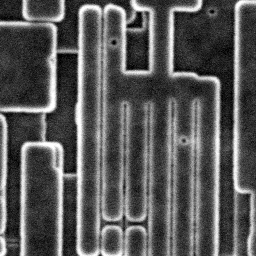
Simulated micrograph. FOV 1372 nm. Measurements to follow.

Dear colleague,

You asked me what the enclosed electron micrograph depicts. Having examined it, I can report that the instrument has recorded wiring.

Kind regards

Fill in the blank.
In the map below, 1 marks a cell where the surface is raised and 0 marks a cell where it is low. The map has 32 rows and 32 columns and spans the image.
00011111000000000111111110000011
00011111001111100001110000000111
00011110001111110001110000000111
11111110001111110001110000000111
11111110001111110001110000000111
11111110001111110001110000000111
11111110001111110001110000000111
11111110001111110001110000000111
11111110001111110001110000000111
11111110001111111111111110000111
11111110001111111111111111100111
11111110001111111111111111100111
11111110001111111111111111100111
11111100001111111111111111100111
00000000001111111111111111100111
10000000001111111111111111100111
10000000001111111111111111100111
10000000001111111111111111100111
10011110001111111111111111100111
10011110001111111111111111100111
10011110001111111111111111100111
10011111001111111111111111100111
10011111001111111111111111100111
10011111001111111111111111100111
10011111001111111111111111100001
10011111001111111111111111100001
10011111001111111111111111100001
10011111001111101111111111100001
10011111001101101111111111100001
00011111001111111111111111100001
10011111001111111111111111100001
10011111001111111111111111100001